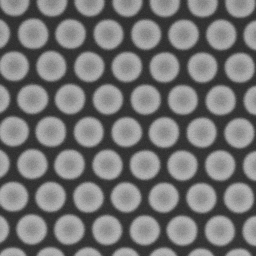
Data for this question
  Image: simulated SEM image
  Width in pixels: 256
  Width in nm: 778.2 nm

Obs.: an array of small figures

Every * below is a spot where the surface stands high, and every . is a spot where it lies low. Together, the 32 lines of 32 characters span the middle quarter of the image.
...*******..*******...*******..*
...*******..*******...*******..*
...******...*******...******...*
....*****....*****....******....
................................
***......***.......**........*..
*****...******....*****....*****
*****...******...*******..******
*****..*******...*******..******
*****..*******...*******..******
*****...******...*******...*****
****....******....*****....*****
............................***.
...............**.......**......
....*****....*****.....*****....
...*******..*******...******...*
...*******..*******..********..*
...*******..*******..********..*
...*******..*******..*******...*
....*****....*****....******....
.....**.......***......****.....
................................
****....*****.....*****....*****
*****...******...******...******
*****..*******...*******..******
*****..*******...*******..******
*****..*******...*******..******
****....******...******....*****
***......****......***......****
................................
....*****....*****.....****.....
...******...*******...******...*